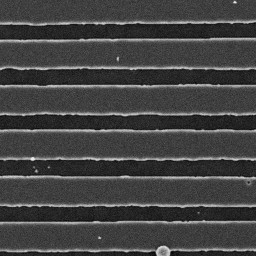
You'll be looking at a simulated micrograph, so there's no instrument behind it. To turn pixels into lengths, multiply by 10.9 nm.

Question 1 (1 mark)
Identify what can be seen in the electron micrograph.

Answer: lines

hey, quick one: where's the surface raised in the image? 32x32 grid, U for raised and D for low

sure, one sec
UUUUUUUUUUUUUUUUUUUUUUUUUUUUUUUU
UUUUUUUUUUUUUUUUUUUUUUUUUUUUUUUU
UUUUUUUUUUUUUUUUUUUUUUUUUUUUUUUU
DDDDDDDDDDDDDDDDDDDDDDDDDDDDDDDD
DDDDDDDDDDDDDDDDDDDDDDDDDDDDDDDD
UUUUUUUUUUUUUUUUUUUUUUUUUUUUUUUU
UUUUUUUUUUUUUUUUUUUUUUUUUUUUUUUU
UUUUUUUUUUUUUUUUUUUUUUUUUUUUUUUU
UUUUUUUUUUDUUUUUUUUUUUUUUUUUUUUU
DDDDDDDDDDDDDDDDDDDDDDDDDDDDDDDD
DDDDDDDDDDDDDDDDDDDDDDDDDDDDDDDD
UUUUUUUUUUUUUUUUUUUUUUUUUUUUUUUU
UUUUUUUUUUUUUUUUUUUUUUUUUUUUUUUU
UUUUUUUUUUUUUUUUUUUUUUUUUUUUUUUU
DDDDDDDDDDDDDDDDDDDDDDDDDDDDDDDD
DDDDDDDDDDDDDDDDDDDDDDDDDDDDDDDD
UUUUUUUUUUUUUUUUUUUUUUUUUUUUUUUU
UUUUUUUUUUUUUUUUUUUUUUUUUUUUUUUU
UUUUUUUUUUUUUUUUUUUUUUUUUUUUUUUU
UUUUUUUUUUUUUUUUUUUUUUUUUUUUUUUU
DDDDDDDDDDDDDDDDDDDDDDDDDDDDDDDD
DDDDDDDDDDDDDDDDDDDDDDDDDDDDDDDD
UUUUUUUUUUUUUUUUUUUUUUUUUUUUUUUU
UUUUUUUUUUUUUUUUUUUUUUUUUUUUUUUU
UUUUUUUUUUUUUUUUUUUUUUUUUUUUUUUU
UUUUUUUUUUUUUUUUUUUUUUUUUUUUUUUU
DDDDDDDDDDDDDDDDDDDDDDDDDDDDDDDD
DDDDDDDDDDDDDDDDDDDDDDDDDDDDDDDD
UUUUUUUUUUUUUUUUUUUUUUUUUUUUUUUU
UUUUUUUUUUUUUUUUUUUUUUUUUUUUUUUU
UUUUUUUUUUUUUUUUUUUUUUUUUUUUUUUU
DDDDDDDDDDDDDDDDDDDUUDDDDDDDDDDD